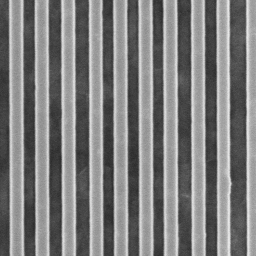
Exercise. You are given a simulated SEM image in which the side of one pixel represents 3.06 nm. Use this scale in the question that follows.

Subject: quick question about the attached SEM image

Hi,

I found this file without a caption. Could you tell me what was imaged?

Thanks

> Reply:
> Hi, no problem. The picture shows parallel lines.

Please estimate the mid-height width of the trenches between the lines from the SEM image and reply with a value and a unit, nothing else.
39.8 nm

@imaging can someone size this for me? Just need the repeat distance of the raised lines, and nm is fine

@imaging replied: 79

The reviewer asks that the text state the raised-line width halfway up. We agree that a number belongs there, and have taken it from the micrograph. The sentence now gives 39.4 nm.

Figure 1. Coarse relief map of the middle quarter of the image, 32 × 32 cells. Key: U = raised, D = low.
UUUDDDDUUDDDDUUUDDDUUUDDDUUUDDDD
UUUDDDDUUDDDDUUUDDDUUUDDDUUUDDDD
UUUDDDDUUDDDDUUUDDDUUUDDDUUUDDDD
UUUDDDDUUDDDDUUUDDDUUUDDDUUUDDDD
UUUDDDDUUUDDDUUUDDDUUUDDDUUUDDDD
UUUDDDDUUDDDDUUUDDDUUUDDDUUUDDDD
UUUDDDDUUUDDDUUUDDDUUUDDDUUUDDDD
UUDDDDDUUUDDDUUUDDDUUUDDDUUUDDDD
UUDDDDDUUDDDDUUUDDDUUUDDDUUUDDDD
UUUDDDDUUDDDDUUUDDDUUUDDDUUUDDDD
UUUDDDDUUDDDDUUUDDDUUUDDDUUUDDDD
UUUDDDDUUDDDDUUUDDDUUUDDDUUUDDDD
UUUDDDDUUDDDDUUUDDDUUUDDDUUUDDDD
UUUDDDDUUDDDDUUUDDDUUUDDDUUUDDDD
UUUDDDDUUDDDDUUUDDDUUUDDDUUUDDDD
UUDDDDDUUDDDDUUUDDDUUUDDDUUUDDDD
UUUDDDDUUDDDDUUUDDDUUUDDDUUUDDDD
UUUDDDDUUDDDDUUUDDDUUUDDDUUUDDDD
UUUDDDDUUDDDDUUUDDDUUUDDDUUUDDDD
UUUDDDDUUDDDDUUUDDDUUUDDDUUUDDDD
UUUDDDDUUDDDDUUUDDDUUUDDDUUUDDDD
UUUDDDDUUUDDDUUUDDDUUUDDDUUUDDDD
UUUDDDDUUDDDDUUUDDDUUUDDDUUUDDDD
UUUDDDDUUDDDDUUUDDDUUUDDDUUUDDDD
UUUDDDDUUUDDDUUUDDDUUUDDDUUUDDDD
UUUDDDDUUDDDDUUUDDDUUUDDDUUUDDDD
UUUDDDDUUUDDDUUUDDDUUUDDDUUUDDDD
UUUDDDDUUUDDDUUUDDDUUUDDDUUUDDDD
UUUDDDDUUDDDDUUUDDDUUUDDDUUUDDDD
UUUDDDDUUDDDDUUUDDDUUUDDDUUUDDDD
UUUDDDDUUDDDDUUUDDDUUUDDDUUUDDDD
UUUDDDDUUDDDDUUUDDDUUUDDDUUUDDDD